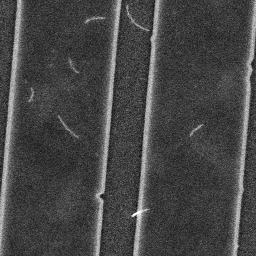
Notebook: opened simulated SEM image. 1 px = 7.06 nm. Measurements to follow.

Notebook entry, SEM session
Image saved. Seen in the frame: one or a few lines or trenches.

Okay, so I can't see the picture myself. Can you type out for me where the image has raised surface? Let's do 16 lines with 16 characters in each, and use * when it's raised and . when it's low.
.******...******
.******...******
.******...******
.******...******
.******..*******
.******..*******
.******..******.
.******..******.
*******..******.
*******..******.
*******..******.
******...******.
******...******.
******...******.
******...******.
******..*******.